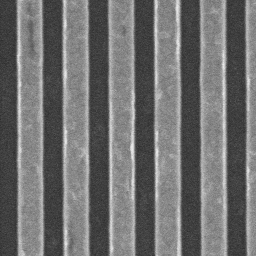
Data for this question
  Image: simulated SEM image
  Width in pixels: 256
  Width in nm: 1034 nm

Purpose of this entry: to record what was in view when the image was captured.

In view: parallel lines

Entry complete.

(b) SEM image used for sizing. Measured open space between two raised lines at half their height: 85.9 nanometers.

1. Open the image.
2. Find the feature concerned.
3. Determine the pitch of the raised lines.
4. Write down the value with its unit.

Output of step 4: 185 nm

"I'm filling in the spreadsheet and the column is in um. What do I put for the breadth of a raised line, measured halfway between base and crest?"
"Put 0.098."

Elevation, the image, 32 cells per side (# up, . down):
..###...###...###..###...###...#
..###...###...###..###...###...#
..###...###...###..###...###...#
..###...###...###..###...###...#
..###...###...###..###...###...#
..###...###...###..###...###...#
..###...###...###..###...###...#
..###...###...###..###...###...#
..###...###...###..###...###...#
..###...###...###..###...###...#
..###...###...###..###...###...#
..###...###...###..###...###...#
..###...###...###..###...###...#
..###...###...###..###...###...#
..###...###...###..###...###...#
..###...###...###..###...###...#
..###...###...###..###...###...#
..###...###...###..###...###...#
..###...###...###..###...###...#
..###...###...###..###...###...#
..###...###...###..###...###...#
..###...###...###..###...###...#
..###...###...###..###...###...#
..###...###...###..###...###...#
..###...###...###..###...###...#
..###...###...###...##...###...#
..###...###...###...##...###...#
..###...###...###...##...###...#
..###...###...###...##...###...#
..###...###...###...##...###...#
..###...###...###...###..###...#
..###...###...###...###..###...#